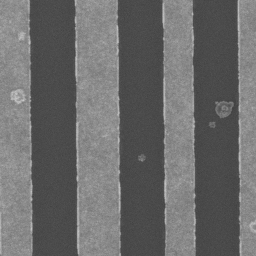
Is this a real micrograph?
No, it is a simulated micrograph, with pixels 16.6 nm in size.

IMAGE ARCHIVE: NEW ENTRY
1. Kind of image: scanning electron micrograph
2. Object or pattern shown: lines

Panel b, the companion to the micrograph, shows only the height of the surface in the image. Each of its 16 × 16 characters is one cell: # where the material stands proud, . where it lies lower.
##...##...##...#
##...##...##...#
##...##...##...#
##...##...##...#
##...##...##...#
##...##...##...#
##...##...##...#
##...##...##...#
##...##...##...#
##...##...##...#
##...##...##...#
##...##...##...#
##...##...##...#
##...##...##...#
##...###..##...#
##...###..##...#